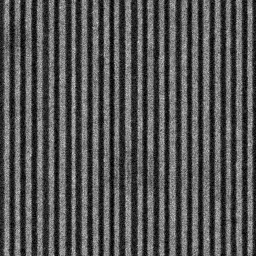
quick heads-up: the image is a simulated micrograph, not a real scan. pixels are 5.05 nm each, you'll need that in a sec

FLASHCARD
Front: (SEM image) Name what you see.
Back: parallel lines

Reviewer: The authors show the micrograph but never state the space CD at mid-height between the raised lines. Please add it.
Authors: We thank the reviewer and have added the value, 27.1 nm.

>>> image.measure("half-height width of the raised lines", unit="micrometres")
0.0265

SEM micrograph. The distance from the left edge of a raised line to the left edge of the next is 0.0559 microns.